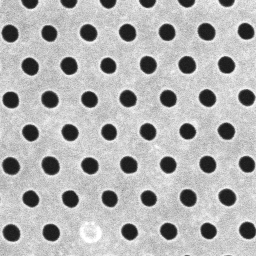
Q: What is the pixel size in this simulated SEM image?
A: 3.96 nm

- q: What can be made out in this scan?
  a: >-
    a regular array of holes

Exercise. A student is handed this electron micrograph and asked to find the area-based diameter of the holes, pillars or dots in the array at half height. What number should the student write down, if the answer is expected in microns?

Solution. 0.0645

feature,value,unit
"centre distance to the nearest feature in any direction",152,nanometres